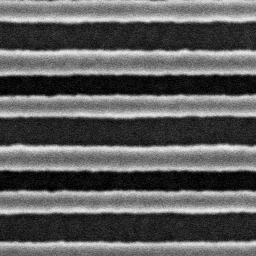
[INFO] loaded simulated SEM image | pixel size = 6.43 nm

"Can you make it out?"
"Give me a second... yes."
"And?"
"lines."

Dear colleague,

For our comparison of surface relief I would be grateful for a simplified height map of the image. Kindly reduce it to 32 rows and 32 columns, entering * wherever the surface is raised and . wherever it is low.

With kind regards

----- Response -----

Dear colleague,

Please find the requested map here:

********************************
********************************
*******************.*******.***.
................................
................................
................................
*.***.***************.****..****
********************************
********************************
................................
................................
................................
********************************
********************************
******.....*********.**..*......
................................
................................
................................
****************...*************
********************************
********************************
................................
................................
................................
********************************
********************************
**..*...........................
................................
................................
................................
***************..*.*************
********************************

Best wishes